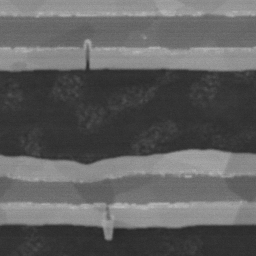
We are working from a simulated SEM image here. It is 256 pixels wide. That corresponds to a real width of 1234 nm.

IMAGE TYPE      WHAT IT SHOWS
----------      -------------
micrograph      one or a few lines or trenches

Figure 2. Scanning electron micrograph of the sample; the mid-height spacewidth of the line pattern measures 106 px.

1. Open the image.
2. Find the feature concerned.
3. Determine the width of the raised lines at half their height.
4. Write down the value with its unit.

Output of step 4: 0.253 um